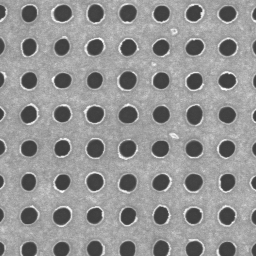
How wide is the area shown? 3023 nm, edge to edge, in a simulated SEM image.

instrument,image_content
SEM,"a regular array of holes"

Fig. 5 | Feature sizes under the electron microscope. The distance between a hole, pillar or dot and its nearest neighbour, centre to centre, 32.9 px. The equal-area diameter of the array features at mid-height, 196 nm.